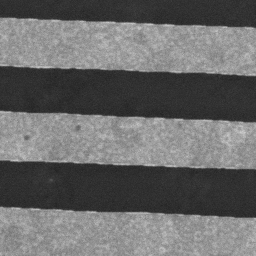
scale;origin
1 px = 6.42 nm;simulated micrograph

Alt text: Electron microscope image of lines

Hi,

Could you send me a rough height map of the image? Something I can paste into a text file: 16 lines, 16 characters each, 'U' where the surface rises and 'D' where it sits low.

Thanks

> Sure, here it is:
DDDDDDDDDDDDDDDD
UUUUUUUUUDDDDDDD
UUUUUUUUUUUUUUUU
UUUUUUUUUUUUUUUU
DDDDDDDDDDDDDUUU
DDDDDDDDDDDDDDDD
DDDDDDDDDDDDDDDD
UUUUUUUUUUUUDDDD
UUUUUUUUUUUUUUUU
UUUUUUUUUUUUUUUU
DDDDDDDDDDDDDDUU
DDDDDDDDDDDDDDDD
DDDDDDDDDDDDDDDD
UUUUUUUUUUUUUDDD
UUUUUUUUUUUUUUUU
UUUUUUUUUUUUUUUU